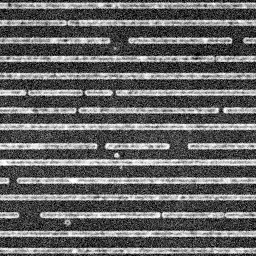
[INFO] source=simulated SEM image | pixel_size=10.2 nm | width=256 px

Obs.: parallel lines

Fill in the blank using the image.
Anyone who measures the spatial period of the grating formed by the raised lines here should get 178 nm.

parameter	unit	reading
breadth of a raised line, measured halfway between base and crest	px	4.74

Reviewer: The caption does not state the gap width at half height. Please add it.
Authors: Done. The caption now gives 126 nm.